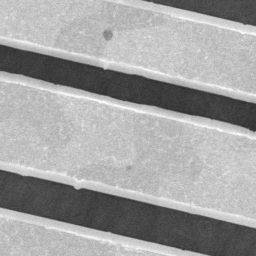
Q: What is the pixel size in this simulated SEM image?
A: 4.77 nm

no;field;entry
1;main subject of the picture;one or a few lines or trenches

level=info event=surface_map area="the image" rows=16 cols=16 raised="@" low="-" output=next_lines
@@@@@@@@@@------
@@@@@@@@@@@@@@--
@@@@@@@@@@@@@@@@
----@@@@@@@@@@@@
---------@@@@@@@
@@@@---------@@@
@@@@@@@@--------
@@@@@@@@@@@@----
@@@@@@@@@@@@@@@@
@@@@@@@@@@@@@@@@
-@@@@@@@@@@@@@@@
-----@@@@@@@@@@@
----------@@@@@@
@-------------@@
@@@@@@----------
@@@@@@@@@@------